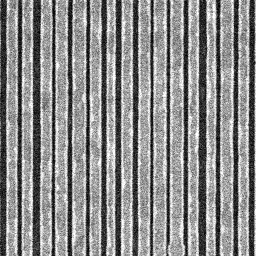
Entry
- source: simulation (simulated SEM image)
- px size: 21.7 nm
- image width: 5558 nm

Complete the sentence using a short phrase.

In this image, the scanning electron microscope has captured parallel lines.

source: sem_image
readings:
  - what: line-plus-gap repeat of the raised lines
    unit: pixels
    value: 16.5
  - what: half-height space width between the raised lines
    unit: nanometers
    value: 133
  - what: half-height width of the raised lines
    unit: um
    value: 0.209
